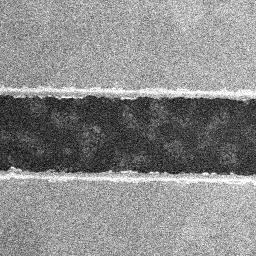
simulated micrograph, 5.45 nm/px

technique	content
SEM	one or a few lines or trenches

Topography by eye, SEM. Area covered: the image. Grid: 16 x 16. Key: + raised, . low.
++++++++++++++++
++++++++++++++++
++++++++++++++++
++++++++++++++++
++++++++++++++++
++++++++++++++++
................
................
................
................
................
++++++++++++++++
++++++++++++++++
++++++++++++++++
++++++++++++++++
++++++++++++++++